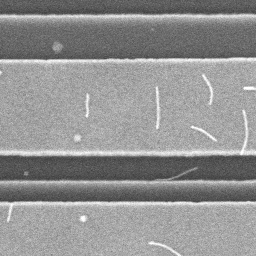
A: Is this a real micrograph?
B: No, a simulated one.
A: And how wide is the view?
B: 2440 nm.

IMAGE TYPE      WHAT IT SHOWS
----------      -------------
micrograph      lines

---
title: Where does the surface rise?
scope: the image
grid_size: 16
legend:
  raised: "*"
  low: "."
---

................
................
................
................
****************
****************
****************
****************
****************
****************
................
................
................
****************
****************
****************